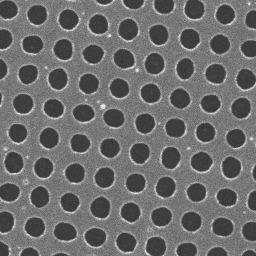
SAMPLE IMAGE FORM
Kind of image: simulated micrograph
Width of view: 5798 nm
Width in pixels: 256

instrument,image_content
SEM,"a regular array of holes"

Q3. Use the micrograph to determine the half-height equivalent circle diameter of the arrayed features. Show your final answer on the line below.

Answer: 457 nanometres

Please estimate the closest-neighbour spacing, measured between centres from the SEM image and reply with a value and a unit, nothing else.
676 nm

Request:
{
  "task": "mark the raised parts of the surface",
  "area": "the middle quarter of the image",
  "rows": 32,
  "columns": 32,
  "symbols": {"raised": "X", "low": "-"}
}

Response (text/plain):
XXXXXXXXXXXXX----XXX-----XXX----
XXXXXXXXXXXXXXXXXXXX-----XXX----
-XXXX--XXXXXXXXXXXXXXX-XXXXX----
-XXX----XXXXXXXXXXXXXXXXXXXXX--X
-XXX-----XXX----XXXXXXXXXXXXXXXX
XXXX-----XX-----XXXX---XXXXXXXXX
XXXX----XXX-----XXX-----XXXX--XX
XXXXX--XXXXX----XXX-----XXX----X
XXXXXXXXXXXXX--XXXX-----XXX-----
XXXXXXXXXXXXXXXXXXXX---XXXX-----
XXX----XXXXXXXXXXXXXXXXXXXX----X
XX-----XXXX---XXXXXXXXXXXXXXXXXX
XX------XX-----XXXX--XXXXXXXXXXX
XXX----XXX-----XXX----XXXXX-XXXX
XXXX-XXXXX-----XXX-----XXX----XX
XXXXXXXXXXX---XXXX-----XX-----XX
XXXXXXXXXXXXXXXXXX----XXX-----XX
XXXXXXXXXXXXXXXXXXXXXXXXXX----XX
XX----XXXXXXXXXXXXXXXXXXXXXXXXXX
XX-----XXX---XXXXXXXXXXXXXXXXXXX
XX-----XX-----XXX----XXXXXXXXXXX
XX----XXX-----XXX----XXXX---XXXX
XXXXXXXXXX---XXXX----XXX-----XXX
XXXXXXXXXXX-XXXXX----XXX-----XXX
XXXXXXXXXXXXXXXXXX--XXXX-----XXX
X----XXXXXXXXXXXXXXXXXXXX---XXXX
-----XXXX---XXXXXXXXXXXXXXXXXXXX
-----XXX-----XXXX--XXXXXXXXXXXXX
X----XXX-----XXX----XXXX---XXXXX
XX--XXXX----XXX-----XXX-----XXXX
XXXXXXXXX---XXXX----XXX-----XXX-
XXXXXXXXXXXXXXXX----XXX-----XXX-